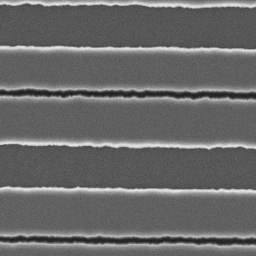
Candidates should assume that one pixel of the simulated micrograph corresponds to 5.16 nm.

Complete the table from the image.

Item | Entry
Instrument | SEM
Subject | lines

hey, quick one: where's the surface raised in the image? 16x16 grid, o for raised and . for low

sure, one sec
................
................
................
oooooooooooooooo
oooooooooooooooo
oooooooooooooooo
oooooooooooooooo
oooooooooooooooo
oooooooooooooooo
................
................
................
oooooooooooooooo
oooooooooooooooo
oooooooooooooooo
oooooooooooooooo